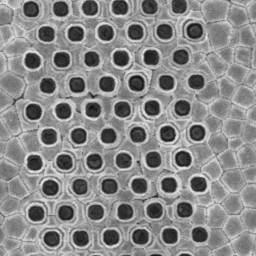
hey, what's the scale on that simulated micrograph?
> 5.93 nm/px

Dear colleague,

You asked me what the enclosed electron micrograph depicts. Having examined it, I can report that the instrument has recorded a regular array of holes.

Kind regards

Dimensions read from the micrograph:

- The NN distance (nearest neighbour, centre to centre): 0.173 µm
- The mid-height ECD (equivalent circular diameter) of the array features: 100 nanometres